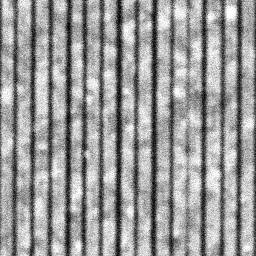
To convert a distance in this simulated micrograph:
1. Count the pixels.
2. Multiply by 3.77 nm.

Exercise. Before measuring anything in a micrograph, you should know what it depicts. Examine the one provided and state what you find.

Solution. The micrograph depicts parallel lines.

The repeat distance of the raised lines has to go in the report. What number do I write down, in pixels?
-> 17.2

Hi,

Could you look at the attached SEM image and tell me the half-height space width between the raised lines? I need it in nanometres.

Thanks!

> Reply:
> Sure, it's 20.2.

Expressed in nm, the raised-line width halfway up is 44.2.